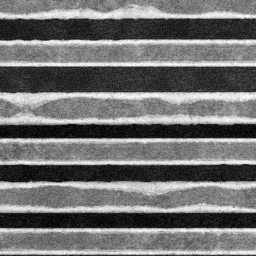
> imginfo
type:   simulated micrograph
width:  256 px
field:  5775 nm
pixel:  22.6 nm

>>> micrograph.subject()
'lines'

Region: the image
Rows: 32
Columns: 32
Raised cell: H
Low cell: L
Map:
HHHHHHHHHHHHHHHHHHHHHHHHHHHHHHHH
HHHHHHHHHHHHHHHHHHHHHHHHHHHHHHHH
LLLLLLLLLLLLLLLLLLLLLLLLLLLLLLLL
LLLLLLLLLLLLLLLLLLLLLLLLLLLLLLLL
LLLLLLLLLLLLLLLLLLLLLLLLLLLLLLLL
HHHHHHHHHHHHHHHHHHHHHHHHHHHHHHHH
HHHHHHHHHHHHHHHHHHHHHHHHHHHHHHHH
HHHHHHHHHHHHHHHHHHHHHHHHHHHHHHHH
LLLLLLLLLLLLLLLLLLLLLLLLLLLLLLLL
LLLLLLLLLLLLLLLLLLLLLLLLLLLLLLLL
LLLLLLLLLLLLLLLLLLLLLLLLLLLLLLLL
LLLLLLLLLLLLLLLLLLLLLLLLLLLLLLLL
HHHHHHHHHHHHHHHHHHHHHHHHHHHHHHHH
HHHHHHHHHHHHHHHHHHHHHHHHHHHHHHHH
HHHHHHHHHHHHHHHHHHHHHHHHHHHHHHHH
LLLLLLLLLLLLLLLLLLLLLLLLLLLLLLLL
LLLLLLLLLLLLLLLLLLLLLLLLLLLLLLLL
HHHHHHHHHHHHHHHHHHHHHHHHHHHHHHHH
HHHHHHHHHHHHHHHHHHHHHHHHHHHHHHHH
HHHHHHHHHHHHHHHHHHHHHHHHHHHHHHHH
LLLLHHHLHHHHHLLLLLLLLLLLLLLLLLLL
LLLLLLLLLLLLLLLLLLLLLLLLLLLLLLLL
LLLLLLLLLLLLLLLLLLLLLLLLLLLLLLLL
HHHHHHHHHHHHHHHHHHHHHHHHHHHHHHHH
HHHHHHHHHHHHHHHHHHHHHHHHHHHHHHHH
HHHHHHHHHHHHHHHHHHHHHHHHHHHHHHHH
LLLLLLLLLLLLLLLLLLLLLLLLLLLLLLLL
LLLLLLLLLLLLLLLLLLLLLLLLLLLLLLLL
LLLLLLLLLLLLLLLLLLLLLLLLLLLLLLLL
HHHHHHHHHHHHHHHHHHHHHHHHHHHHHHHH
HHHHHHHHHHHHHHHHHHHHHHHHHHHHHHHH
HHHHHHHHHHHHHHHHHHHHHHHHHHHHHHHH